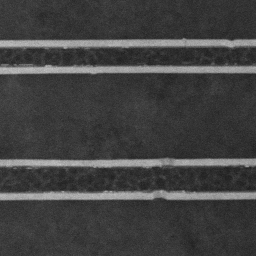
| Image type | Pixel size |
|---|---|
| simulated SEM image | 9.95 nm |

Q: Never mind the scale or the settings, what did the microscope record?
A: one or a few lines or trenches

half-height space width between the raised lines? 921 nm